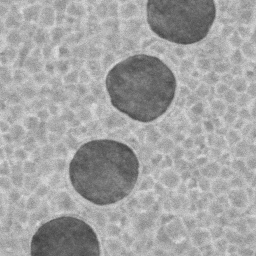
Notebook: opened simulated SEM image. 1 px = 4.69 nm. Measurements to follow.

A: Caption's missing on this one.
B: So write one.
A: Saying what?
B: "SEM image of holes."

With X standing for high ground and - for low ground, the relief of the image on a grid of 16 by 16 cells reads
XXXXXXXXX-----XX
XXXXXXXXX----XXX
XXXXXXXXXX---XXX
XXXXXXXX--XXXXXX
XXXXXXX----XXXXX
XXXXXXX----XXXXX
XXXXXXX----XXXXX
XXXXXXXX--XXXXXX
XXXXXXXXXXXXXXXX
XXXXX---XXXXXXXX
XXXX-----XXXXXXX
XXXX-----XXXXXXX
XXXXX---XXXXXXXX
XXXXXXXXXXXXXXXX
XX----XXXXXXXXXX
XX----XXXXXXXXXX